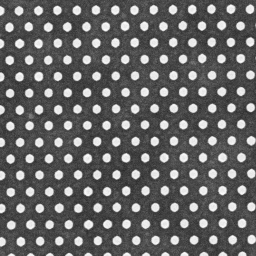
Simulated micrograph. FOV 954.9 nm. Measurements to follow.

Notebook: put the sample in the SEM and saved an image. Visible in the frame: a regular array of raised bodies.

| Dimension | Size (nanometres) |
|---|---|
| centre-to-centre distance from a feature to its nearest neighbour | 69.9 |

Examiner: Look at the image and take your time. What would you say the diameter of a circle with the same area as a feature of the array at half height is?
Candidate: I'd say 0.0313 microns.